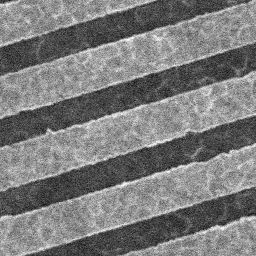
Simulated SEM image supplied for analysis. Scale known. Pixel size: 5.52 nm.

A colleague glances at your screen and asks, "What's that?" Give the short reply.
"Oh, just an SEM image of one or a few lines or trenches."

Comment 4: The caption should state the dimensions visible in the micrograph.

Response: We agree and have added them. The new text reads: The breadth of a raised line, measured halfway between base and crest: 219 nm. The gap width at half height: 28.6 pixels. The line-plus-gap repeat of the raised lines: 380 nanometers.